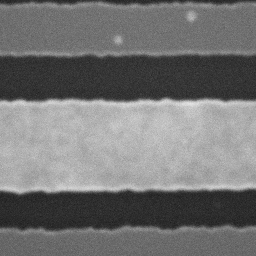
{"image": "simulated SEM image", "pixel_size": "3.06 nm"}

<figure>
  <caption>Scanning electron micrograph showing lines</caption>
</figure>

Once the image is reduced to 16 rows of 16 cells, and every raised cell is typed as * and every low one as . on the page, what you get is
****************
****************
****************
................
................
................
****************
****************
****************
****************
****************
****************
................
................
****************
****************